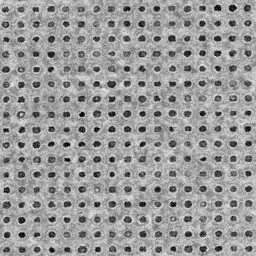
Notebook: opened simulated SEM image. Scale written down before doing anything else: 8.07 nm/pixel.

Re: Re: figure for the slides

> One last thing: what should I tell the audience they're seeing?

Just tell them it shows a regular array of holes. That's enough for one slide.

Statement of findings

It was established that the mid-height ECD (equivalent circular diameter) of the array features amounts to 0.0604 µm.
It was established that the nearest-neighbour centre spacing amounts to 0.118 um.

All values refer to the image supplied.